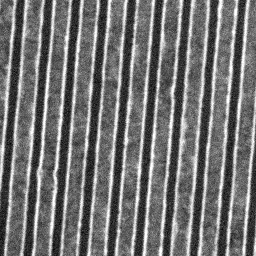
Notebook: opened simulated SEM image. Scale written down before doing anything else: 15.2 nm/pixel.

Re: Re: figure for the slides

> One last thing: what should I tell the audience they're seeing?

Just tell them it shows parallel lines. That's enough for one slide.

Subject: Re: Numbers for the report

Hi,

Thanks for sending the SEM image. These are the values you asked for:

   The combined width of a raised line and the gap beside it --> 419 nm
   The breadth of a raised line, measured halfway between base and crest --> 0.25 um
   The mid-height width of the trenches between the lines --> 0.167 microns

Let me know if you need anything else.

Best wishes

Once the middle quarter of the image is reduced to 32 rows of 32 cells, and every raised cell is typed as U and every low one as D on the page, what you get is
DDDUUUUDDDUUUUDDDUUUUDDDUUUUDDDU
DDDUUUUDDDUUUUDDDUUUUDDDUUUUDDDU
DDDUUUUDDDUUUUDDDUUUUDDDUUUUDDDU
DDDUUUUDDDUUUUDDDUUUUDDDUUUUDDDU
DDDUUUUDDDUUUUDDDUUUUDDDUUUUDDUU
DDDUUUUDDDUUUUDDDUUUUDDUUUUDDDUU
DDDUUUUDDDUUUUDDDUUUDDDUUUUDDDDU
DDDUUUUDDDUUUUDDUUUUDDDUUUUDDDUU
DDDUUUUDDUUUUDDDUUUUDDDUUUUDDDUU
DDDUUUDDDUUUUDDDUUUUDDDUUUUDDDUU
DDUUUUDDDUUUUDDDUUUUDDDUUUUDDDUU
DDUUUUDDDUUUUDDDUUUUDDDUUUUDDDUU
DDUUUUDDDUUUUDDDUUUUDDDUUUUDDDUU
DDUUUUDDDUUUUDDDUUUUDDDUUUUDDDUU
DDUUUUDDDUUUUDDDUUUUDDDUUUUDDDUU
DDUUUUDDDUUUUDDDUUUUDDDUUUUDDDUU
DDUUUUDDDUUUUDDDUUUUDDDUUUUDDUUU
DDUUUUDDDUUUUDDDUUUUDDUUUUUDDUUU
DDUUUUDDDUUUUDDDUUUDDDUUUUUDDUUU
DDUUUUDDDUUUUDDUUUUDDDUUUUDDDUUU
DDUUUUDDUUUUDDDUUUUDDDUUUUDDDUUU
DDUUUDDDUUUUDDDUUUUDDDUUUUDDDUUU
DUUUUDDDUUUUDDDUUUUDDDUUUUDDDUUU
DUUUUDDDUUUUDDDUUUUDDDUUUUDDDUUU
DUUUUDDDUUUUDDDUUUUDDDUUUUDDDUUU
DUUUUDDDUUUUDDDUUUUDDDUUUUDDDUUU
DUUUUDDDUUUUDDDUUUUDDDUUUUDDDUUU
DUUUUDDDUUUUDDDUUUUDDDUUUUDDDUUU
DUUUUDDDUUUUDDDUUUUDDDUUUUDDUUUU
DUUUUDDDUUUUDDDUUUUDDDUUUDDDUUUU
DUUUUDDDUUUUDDDUUUDDDUUUUDDDUUUU
DUUUUDDDUUUUDDUUUUUDDUUUUDDDUUUU